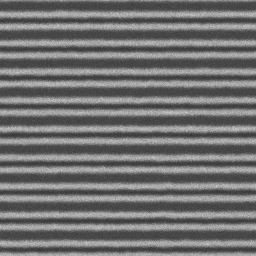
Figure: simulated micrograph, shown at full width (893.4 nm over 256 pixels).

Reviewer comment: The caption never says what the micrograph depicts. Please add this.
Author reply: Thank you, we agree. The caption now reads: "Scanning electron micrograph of parallel lines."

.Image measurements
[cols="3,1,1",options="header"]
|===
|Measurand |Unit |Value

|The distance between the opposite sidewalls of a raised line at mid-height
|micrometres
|0.0218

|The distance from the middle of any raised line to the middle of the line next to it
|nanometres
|50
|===